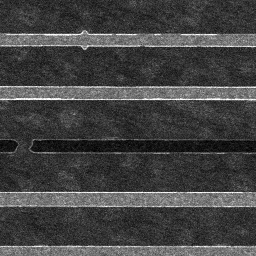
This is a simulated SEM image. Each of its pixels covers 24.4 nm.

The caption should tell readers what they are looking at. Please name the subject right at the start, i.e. parallel lines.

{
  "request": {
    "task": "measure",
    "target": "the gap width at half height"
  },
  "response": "40 pixels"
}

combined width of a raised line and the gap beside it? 1.29 microns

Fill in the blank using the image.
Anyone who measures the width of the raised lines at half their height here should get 0.311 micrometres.